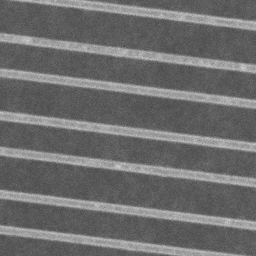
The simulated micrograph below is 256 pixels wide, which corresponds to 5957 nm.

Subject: parallel lines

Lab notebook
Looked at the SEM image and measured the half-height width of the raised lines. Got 0.15 micrometres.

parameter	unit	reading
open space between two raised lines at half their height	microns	0.75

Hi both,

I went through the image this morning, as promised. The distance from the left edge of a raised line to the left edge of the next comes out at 904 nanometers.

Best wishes